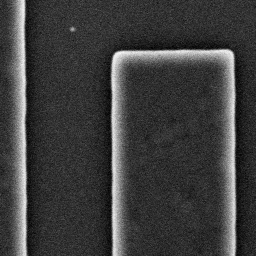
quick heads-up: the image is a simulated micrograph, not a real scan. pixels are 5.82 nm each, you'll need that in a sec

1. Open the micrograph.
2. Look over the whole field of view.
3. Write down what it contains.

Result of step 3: wiring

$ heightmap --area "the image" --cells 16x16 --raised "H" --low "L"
HHLLLLLLLLLLLLLL
HHLLLLLLLLLLLLLL
HLLLLLLLLLLLLLLL
HHLLLLLHHHHHHHLL
HHLLLLLHHHHHHHHL
HHLLLLLHHHHHHHHL
HHLLLLLHHHHHHHHL
HHLLLLLHHHHHHHHL
HHLLLLLHHHHHHHHL
HHLLLLLHHHHHHHHL
HHLLLLLHHHHHHHHL
HHLLLLLHHHHHHHHL
HHLLLLLHHHHHHHHL
HHLLLLLHHHHHHHHL
HHLLLLLHHHHHHHHL
HHLLLLLHHHHHHHHL